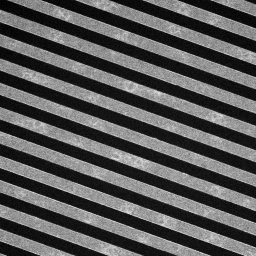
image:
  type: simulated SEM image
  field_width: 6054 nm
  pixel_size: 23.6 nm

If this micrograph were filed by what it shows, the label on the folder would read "parallel lines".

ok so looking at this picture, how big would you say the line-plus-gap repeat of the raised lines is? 541 nanometres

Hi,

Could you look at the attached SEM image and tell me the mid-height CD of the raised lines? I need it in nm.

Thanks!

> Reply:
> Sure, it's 259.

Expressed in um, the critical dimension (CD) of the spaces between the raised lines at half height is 0.284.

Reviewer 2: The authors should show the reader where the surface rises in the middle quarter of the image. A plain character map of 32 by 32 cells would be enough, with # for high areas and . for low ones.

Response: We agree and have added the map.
######.........########.........
.########.........########......
....########.........#######....
......########.........########.
.........########.........######
###.........########.........###
######.........########.........
.########.........########......
...########.........########....
......########.........########.
.........########.........######
###.........########.........###
#####.........########.........#
########.........########.......
...########.........########....
......########.........########.
.........########.........######
##.........########.........####
#####.........########.........#
########.........########.......
...########.........########....
......########.........########.
........########.........#######
##.........########.........####
#####.........########.........#
########.........########.......
..#########........########.....
.....#########........########..
........########.........#######
##.........########.........####
#####.........########.........#
#######.........#########.......